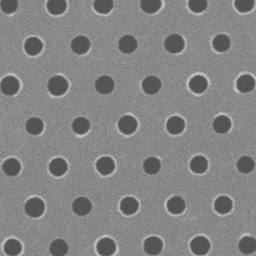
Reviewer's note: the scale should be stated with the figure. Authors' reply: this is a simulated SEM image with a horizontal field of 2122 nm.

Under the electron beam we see a regular array of holes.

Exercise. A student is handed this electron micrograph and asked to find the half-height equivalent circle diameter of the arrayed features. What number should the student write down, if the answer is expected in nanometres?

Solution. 153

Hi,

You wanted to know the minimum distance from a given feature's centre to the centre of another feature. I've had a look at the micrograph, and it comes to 46.3 px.